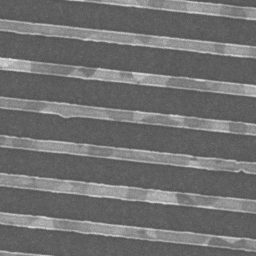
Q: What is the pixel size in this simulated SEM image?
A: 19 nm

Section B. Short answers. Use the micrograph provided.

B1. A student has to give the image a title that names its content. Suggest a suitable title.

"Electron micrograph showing parallel lines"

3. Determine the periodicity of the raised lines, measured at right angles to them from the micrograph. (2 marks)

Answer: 728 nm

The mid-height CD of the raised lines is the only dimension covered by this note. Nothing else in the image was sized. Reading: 205 nanometers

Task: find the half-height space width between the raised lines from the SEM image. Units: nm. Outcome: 528